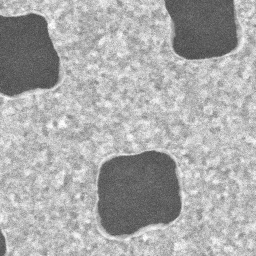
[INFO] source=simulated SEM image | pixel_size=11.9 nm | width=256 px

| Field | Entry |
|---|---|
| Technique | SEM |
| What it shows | holes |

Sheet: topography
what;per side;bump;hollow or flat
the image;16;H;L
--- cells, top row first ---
HHHHHHHHHHLLLLLH
LLLHHHHHHHHLLLLH
LLLHHHHHHHHLLLLH
LLLLHHHHHHHLLLHH
LLLLHHHHHHHHHHHH
LLLHHHHHHHHHHHHH
HHHHHHHHHHHHHHHH
HHHHHHHHHHHHHHHH
HHHHHHHHHHHHHHHH
HHHHHHHHHLHHHHHH
HHHHHHLLLLLHHHHH
HHHHHHLLLLLHHHHH
HHHHHHLLLLLHHHHH
HHHHHHLLLLLHHHHH
HHHHHHHLLHHHHHHH
HHHHHHHHHHHHHHHH